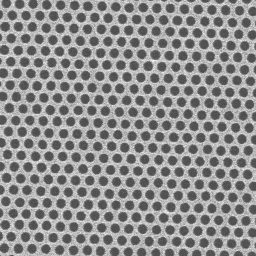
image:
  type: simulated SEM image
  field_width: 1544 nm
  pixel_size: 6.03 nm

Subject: a regular array of holes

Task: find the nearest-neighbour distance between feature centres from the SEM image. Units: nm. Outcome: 79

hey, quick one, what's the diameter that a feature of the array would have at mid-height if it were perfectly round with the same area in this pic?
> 9.64 pixels